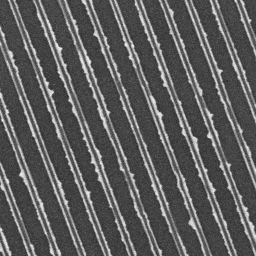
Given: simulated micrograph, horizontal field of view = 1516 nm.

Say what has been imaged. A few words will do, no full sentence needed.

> parallel lines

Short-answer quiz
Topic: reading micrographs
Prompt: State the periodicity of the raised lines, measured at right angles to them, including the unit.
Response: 140 nanometres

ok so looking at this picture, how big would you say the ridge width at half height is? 7.15 px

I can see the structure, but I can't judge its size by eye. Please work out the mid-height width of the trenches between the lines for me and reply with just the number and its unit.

0.0956 micrometres